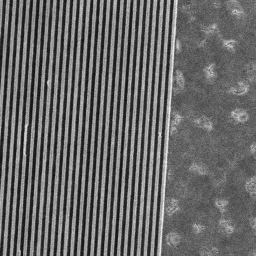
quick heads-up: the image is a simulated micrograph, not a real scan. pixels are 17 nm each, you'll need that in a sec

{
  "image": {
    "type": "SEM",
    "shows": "parallel lines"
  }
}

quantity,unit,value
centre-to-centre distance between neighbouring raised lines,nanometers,114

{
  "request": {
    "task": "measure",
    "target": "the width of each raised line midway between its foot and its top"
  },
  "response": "63.7 nanometres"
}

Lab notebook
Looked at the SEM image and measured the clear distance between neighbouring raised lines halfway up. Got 48.9 nm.